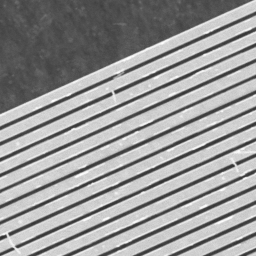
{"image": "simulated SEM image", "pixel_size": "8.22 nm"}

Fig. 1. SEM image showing parallel lines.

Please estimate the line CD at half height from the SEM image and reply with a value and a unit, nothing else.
0.0862 microns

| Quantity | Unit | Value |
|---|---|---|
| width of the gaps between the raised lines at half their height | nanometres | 35.6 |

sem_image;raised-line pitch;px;14.4